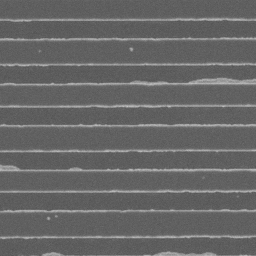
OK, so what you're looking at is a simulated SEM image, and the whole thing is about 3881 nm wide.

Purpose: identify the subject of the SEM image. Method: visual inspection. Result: lines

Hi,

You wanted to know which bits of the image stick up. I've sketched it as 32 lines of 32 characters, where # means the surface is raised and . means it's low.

################################
################################
.###............................
................................
................................
################################
################################
################################
................................
................................
##....#.########################
################################
################################
................................
................................
................................
################################
################################
################################
................................
................................
################################
################################
################################
................................
................................
################################
################################
################################
################################
................................
................................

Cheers